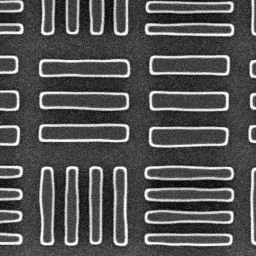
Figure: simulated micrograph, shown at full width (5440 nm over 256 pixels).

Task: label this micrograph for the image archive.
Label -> groups of lines, slits or small figures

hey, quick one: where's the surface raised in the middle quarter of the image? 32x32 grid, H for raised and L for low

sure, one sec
HHHHHHHHHHHHHHHHLLLLLLHHHHHHHHHH
HHHHHHHHHHHHHHHHLLLLLLHHHHHHHHHH
HHHHHHHHHHHHHHHHLLLLLLLLLLLLLLLL
LLLLLLLLLLLLLLLLLLLLLLLLLLLLLLLL
LLLLLLLLLLLLLLLLLLLLLLLLLLLLLLLL
LLLLLLLLLLLLLLLLLLLLLLLLLLLLLLLL
LLLLLLLLLLLLLLLLLLLLLLLLLLLLLLLL
HHHHHHHHHHHHHHHLLLLLLLHHHHHHHHHH
HHHHHHHHHHHHHHHHLLLLLLHHHHHHHHHH
HHHHHHHHHHHHHHHHLLLLLLHHHHHHHHHH
HHHHHHHHHHHHHHHHLLLLLLHHHHHHHHHH
LLLLLLLLLLLLLLLLLLLLLLLLLLLLLLLL
LLLLLLLLLLLLLLLLLLLLLLLLLLLLLLLL
LLLLLLLLLLLLLLLLLLLLLLLLLLLLLLLL
LLLLLLLLLLLLLLLLLLLLLLLLLLLLLLLL
HHHHHHHHHHHHHHHHLLLLLLLLLLLLLLLL
HHHHHHHHHHHHHHHHLLLLLLHHHHHHHHHH
HHHHHHHHHHHHHHHHLLLLLLHHHHHHHHHH
HHHHHHHHHHHHHHHHLLLLLLHHHHHHHHHH
LLLLLLLLLLLLLLLLLLLLLLHHHHHHHHHH
LLLLLLLLLLLLLLLLLLLLLLLHHHHHLLLL
LLLLLLLLLLLLLLLLLLLLLLLLLLLLLLLL
LLLLLLLLLLLLLLLLLLLLLLLLLLLLLLLL
LLLLLLLLLLLLLLLLLLLLLLLLLLLLLLLL
LLLLLLLLLLLLLLLLLLLLLLLLLLLLLLLL
LLLLLLLLLLLLLLLLLLLLLLLLLLLLLLLL
LHHLLLLHHLLLLHHLLLLLLHHHHHHHHHHH
LHHLLLLHHLLLLHHLLLLLLHHHHHHHHHHH
LHHLLLLHHLLLLHHLLLLLLLHHHHHHHHHH
LHHLLLLHHLLLLHHLLLLLLLLLLLLLLLLL
LHHLLLLHHLLLLHHLLLLLLLLLLLLLLLLL
LHHLLLLHHLLLLHHLLLLLLLHHHHHHHHHH